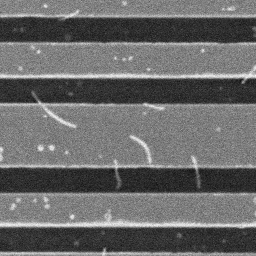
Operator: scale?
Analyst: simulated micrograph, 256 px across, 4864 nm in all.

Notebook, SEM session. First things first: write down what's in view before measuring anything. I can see lines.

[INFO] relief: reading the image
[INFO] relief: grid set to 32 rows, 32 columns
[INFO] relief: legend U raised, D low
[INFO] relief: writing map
UUUUUUUUUUUUUUUUUUUUUUUUUUUUUUUU
UUUUUUUUUUUUUUUUUUUUUUUUUUUUUUUU
DDDDDDDDDDDDDDDDDDDDDDDDDDDDDDDD
DDDDDDDDDDDDDDDDDDDDDDDDDDDDDDDD
DDDDDDDDDDDDDDDDDDDDDDDDDDDDDDDD
UUUUUUUUUUUUUUUUUUUUUUUUUUUUDUUU
UUUUUUUUUUUUUUUUUUUUUUUUUUUUUUUU
UUUUUUUUUUUUUUUUUUUUUUUUUUUUUUUU
UUUUUUUUUUUUUUUUUUUUUUUUUUUUUUUU
UUUUUUUUUUUUUUUUUUUUUUUUUUUUUUUU
DDDDDDDDDDDDDDDDDDDDDDDDDDDDDDDD
DDDDDDDDDDDDDDDDDDDDDDDDDDDDDDDD
DDDDDDDDDDDDDDDDDDDDDDDDDDDDDDDD
UUUUUUUUUUUUUUUUUUUUUUUUUUUUUUUU
UUUUUUUUUUUUUUUUUUUUUUUUUUUUUUUU
UUUUUUUUUUUUUUUUUUUUUUUUUUUUUUUU
UUUUUUUUUUUUUUUUUUUUUUUUUUUUUUUU
UUUUUUUUUUUUUUUUUUUUUUUUUUUUUUUU
UUUUUUUUUUUUUUUUUUUUUUUUUUUUUUUU
UUUUUUUUUUUUUUUUUUUUUUUUUUUUUUUU
UUUUUUUUUUUUUUUUUUUUUUUUUUUUUUUU
DDDDDDDDDDDDDDDDDDDDDDDDDDDDDDDD
DDDDDDDDDDDDDDDDDDDDDDDDDDDDDDDD
DDDDDDDDDDDDDDDDDDDDDDDDDDDDDDDD
UUUUUUUUUUUUUUUUUUUUUUUUUUUUUUUU
UUUUUUUUUUUUUUUUUUUUUUUUUUUUUUUU
UUUUUUUUUUUUUUUUUUUUUUUUUUUUUUUU
UUUUUUUUUUUUUUUUUUUUUUUUUUUUUUUU
DDDDDDDDDDDDDDDDDDDDDDDDDDDDDDDD
DDDDDDDDDDDDDDDDDDDDDDDDDDDDDDDD
DDDDDDDDDDDDDDDDDDDDDDDDDDDDDDDD
DDDDDDDDDDDDUUDDDDDDDDDDDDDDDDDD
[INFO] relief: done